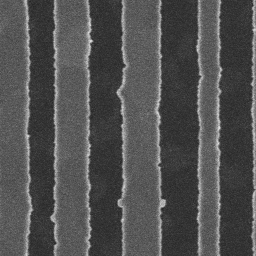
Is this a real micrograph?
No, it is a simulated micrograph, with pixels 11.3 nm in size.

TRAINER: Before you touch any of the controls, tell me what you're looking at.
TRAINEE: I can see one or a few lines or trenches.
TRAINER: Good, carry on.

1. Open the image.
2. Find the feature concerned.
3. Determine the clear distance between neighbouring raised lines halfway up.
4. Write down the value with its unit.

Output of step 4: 382 nm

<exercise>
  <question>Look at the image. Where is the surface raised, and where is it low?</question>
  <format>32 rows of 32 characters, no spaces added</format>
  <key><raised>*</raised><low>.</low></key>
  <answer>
**.....****....*****.....***....
***....****....*****.....**.....
****...****....*****.....**.....
****...****....**..*.....**.....
****...****....**.**.....**.....
****...****....*****.....**.....
****...****....*****.....**.....
****...****....*****.....**.....
****...****.....****.....***....
****...****....*****.....**.....
****...****....*****.....**.....
****...****....*****.....**.....
****...****....*****.....**.....
****...****....*****.....**.....
****...****....*****.....**.....
***....****....*****.....**.....
***....****....*****.....**.....
****...****....*****.....**.....
****...****....*****.....**.....
****...****....*****.....**.....
****...****....*****.....**.....
****...****....*****.....**.....
****...****....*****.....**.....
****...****....*****.....**.....
****...****....*****.....**.....
****...****....******....**.....
****...****....*****.....**.....
****...****....*****.....**.....
****...****....*****.....**.....
***....****....*****.....**.....
***....****....*****.....**.....
***....****....*****.....**.....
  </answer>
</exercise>